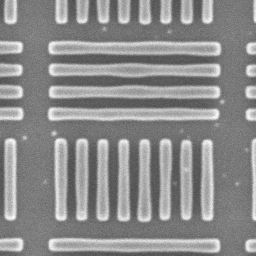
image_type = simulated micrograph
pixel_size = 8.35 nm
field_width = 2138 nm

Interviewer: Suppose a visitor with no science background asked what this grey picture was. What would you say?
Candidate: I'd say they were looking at groups of lines, slits or small figures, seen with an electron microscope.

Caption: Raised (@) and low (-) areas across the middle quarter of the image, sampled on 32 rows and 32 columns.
@@@@@@@@@@@@@@@@@@@@@@@@@@@--@@@
@@@@@@@@@@@@@@@@@@@@@@@@@@@@@@@@
@@@@@@@@@@@@@@@@@@@@@@@@@@@@@@@@
--------------------------------
--------------------------------
--------------------------------
@@@@@@@@@@@@@@@@@@@@@@@@@@@@@@@@
@@@@@@@@@@@@@@@@@@@@@@@@@@@@@@@@
----------------------------@@@-
--------------------------------
--------------------------------
@@@@@@@@@@@@@@@@@@@@@@@@@@@@@@@@
@@@@@@@@@@@@@@@@@@@@@@@@@@@@@@@@
@@@@@@@@@@@@@@@@@@@@@@@@@@@@@@@@
--------------------------------
--------------------------------
--------------------------------
--------------------------------
--------------------------------
---@@@---@@---@@---@@---@@----@-
@--@@@---@@---@@---@@---@@@--@@@
@--@@@---@@---@@---@@---@@@--@@@
@--@@@---@@---@@---@@---@@@--@@@
@--@@@---@@---@@---@@---@@@--@@@
@--@@@---@@---@@---@@---@@@--@@@
---@@@---@@---@@---@@---@@@--@@@
---@@@---@@---@@---@@---@@@--@@@
@--@@@---@@---@@---@@---@@@--@@@
@--@@@---@@---@@---@@---@@---@@@
@--@@@---@@---@@---@@---@@---@@@
@--@@@---@@---@@---@@---@@---@@@
---@@@---@@---@@---@@---@@---@@@